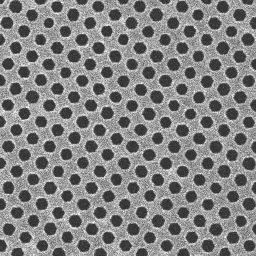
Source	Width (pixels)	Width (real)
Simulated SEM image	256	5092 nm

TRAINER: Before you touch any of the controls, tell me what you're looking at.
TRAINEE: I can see a regular array of holes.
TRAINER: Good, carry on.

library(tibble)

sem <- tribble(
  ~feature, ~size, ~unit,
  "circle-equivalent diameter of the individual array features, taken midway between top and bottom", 243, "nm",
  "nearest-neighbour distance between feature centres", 361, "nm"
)